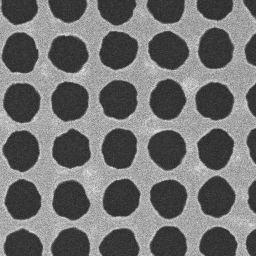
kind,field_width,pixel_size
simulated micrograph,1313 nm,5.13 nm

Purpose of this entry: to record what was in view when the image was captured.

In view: a regular array of holes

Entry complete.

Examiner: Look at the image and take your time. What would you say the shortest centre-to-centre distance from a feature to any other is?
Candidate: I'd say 0.245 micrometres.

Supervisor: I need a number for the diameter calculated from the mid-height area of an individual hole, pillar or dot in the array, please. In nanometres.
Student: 195